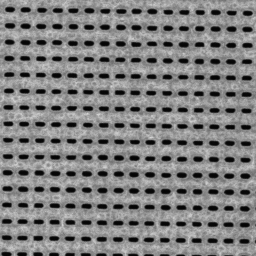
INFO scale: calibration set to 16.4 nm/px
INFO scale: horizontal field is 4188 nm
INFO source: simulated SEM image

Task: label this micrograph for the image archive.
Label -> a regular array of holes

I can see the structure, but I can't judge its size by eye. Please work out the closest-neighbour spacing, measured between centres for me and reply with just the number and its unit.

256 nanometres